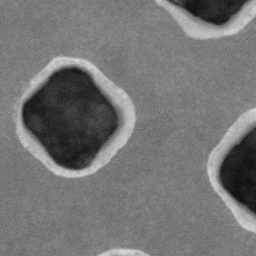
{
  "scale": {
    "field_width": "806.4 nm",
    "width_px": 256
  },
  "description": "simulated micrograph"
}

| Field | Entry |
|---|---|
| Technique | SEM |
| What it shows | holes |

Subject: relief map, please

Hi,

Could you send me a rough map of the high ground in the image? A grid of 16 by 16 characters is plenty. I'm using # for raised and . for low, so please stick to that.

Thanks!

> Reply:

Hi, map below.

###########.....
############...#
################
################
###...##########
##.....#########
#.......########
#.......########
##......#######.
###....#######..
####..#######...
##############..
##############..
###############.
################
################